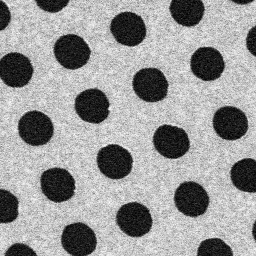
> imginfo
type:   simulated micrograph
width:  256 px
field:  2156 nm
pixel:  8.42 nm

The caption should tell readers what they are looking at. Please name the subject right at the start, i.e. a regular array of holes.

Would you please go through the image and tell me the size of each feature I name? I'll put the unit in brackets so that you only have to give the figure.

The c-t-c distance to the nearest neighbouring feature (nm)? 508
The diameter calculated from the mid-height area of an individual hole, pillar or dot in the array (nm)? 300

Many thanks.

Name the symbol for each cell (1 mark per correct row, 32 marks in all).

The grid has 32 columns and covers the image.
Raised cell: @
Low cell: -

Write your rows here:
-@@@@---@@@@@@@@@@@@@----@@@@@-@
-@@@@@-@@@@@@@@@@@@@@-----@@@@@@
-@@@@@@@@@@@@@----@@@@---@@@@@@@
-@@@@@@@@@@@@@----@@@@@@@@@@@@@-
@@@@@@@@--@@@@----@@@@@@@@@@@@@-
@@@@@@@----@@@@--@@@@@@@@@@@@@@-
@@@@@@@----@@@@@@@@@@@@@---@@@@-
----@@@----@@@@@@@@@@@@@----@@@@
----@@@@--@@@@@@@@-@@@@@----@@@@
----@@@@@@@@@@@@@----@@@----@@@@
@--@@@@@@@@@@@@@@----@@@@@@@@@@@
@@@@@@@@@@---@@@@----@@@@@@@@@@@
@@@@@@@@@-----@@@@--@@@@@@@@@@@@
@@@@@@@@@-----@@@@@@@@@@@@@@--@@
@@@---@@@@---@@@@@@@@@@@@@@----@
@@----@@@@@@@@@@@@@@@@@@@@@----@
@@-----@@@@@@@@@@@@----@@@@----@
@@@---@@@@@@@@@@@@@-----@@@@-@@@
@@@@@@@@@@@@@---@@@-----@@@@@@@@
@@@@@@@@@@@@----@@@@---@@@@@@@@@
@@@@@@@@@@@@-----@@@@@@@@@@@@---
@@@@@@---@@@@---@@@@@@@@@@@@@---
@@@@@----@@@@@@@@@@@@@@@@@@@@---
@@@@@----@@@@@@@@@@@@@---@@@@@--
--@@@@---@@@@@@@@@@@@@----@@@@@@
--@@@@@@@@@@@@@@--@@@@----@@@@@@
--@@@@@@@@@@@@@----@@@@---@@@@@@
--@@@@@@@@@@@@@----@@@@@@@@@@@@@
@@@@@@@@---@@@@----@@@@@@@@@@@@@
@@@@@@@@----@@@@--@@@@@@@@@@@@@@
@@-@@@@@----@@@@@@@@@@@@@---@@@@
@---@@@@----@@@@@@@@@@@@@----@@@